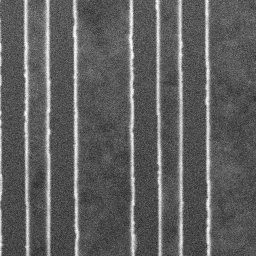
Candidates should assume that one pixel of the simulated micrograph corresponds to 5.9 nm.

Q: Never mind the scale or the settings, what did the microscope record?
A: lines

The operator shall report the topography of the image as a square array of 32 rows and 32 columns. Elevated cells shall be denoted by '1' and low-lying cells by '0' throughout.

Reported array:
00011100011111110000111000111111
00011100011111110000111000111111
00011100011111110000111000111111
00011100011111110000111000111111
00011100011111110000111000111111
00011100011111110000111000111111
00011100011111111000111000111111
00011100011111111000111000111111
00011100011111110000111000111111
00011100011111111000111000111111
00011100011111110000111000111111
00011100011111111000111000111111
00011100011111111000111000111111
00011100011111111000111000111111
00011100011111111000111000111111
00011100011111111000111000111111
00011100011111111000111000111111
00011100001111111000111000111111
00011100001111111000111000111111
00011100001111111000111000111111
00011100011111111000111000111111
00011100011111111000111000111111
00011100011111111000111000111111
00011100011111111000111000111111
00011100011111111000111000111111
00011100001111111000111000111111
00011100001111111000111000111111
00011100001111111000111000111111
00011100001111111000111000111111
00011100001111111000111000111111
00011100001111111000111000111111
00011100001111111000111000111111